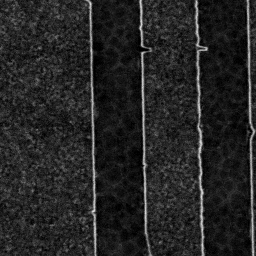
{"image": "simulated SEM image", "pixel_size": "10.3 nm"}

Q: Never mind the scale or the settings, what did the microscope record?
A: one or a few lines or trenches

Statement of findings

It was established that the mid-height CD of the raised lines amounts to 578 nm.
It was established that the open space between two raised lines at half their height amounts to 519 nanometres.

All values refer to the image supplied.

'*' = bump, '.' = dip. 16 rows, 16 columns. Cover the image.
******...***...*
******...***....
******...***....
******...***....
******...***....
******...***....
******...***....
******...***....
******...****...
******...****...
******...****...
******...****...
******...****...
******...****...
******...****...
******...****...